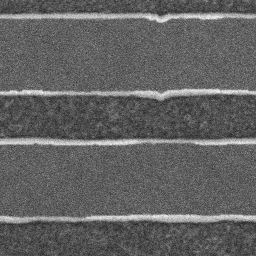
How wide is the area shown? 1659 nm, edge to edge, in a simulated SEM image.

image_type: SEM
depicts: one or a few lines or trenches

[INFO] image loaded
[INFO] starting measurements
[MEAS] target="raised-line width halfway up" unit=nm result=506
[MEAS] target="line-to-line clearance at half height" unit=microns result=0.303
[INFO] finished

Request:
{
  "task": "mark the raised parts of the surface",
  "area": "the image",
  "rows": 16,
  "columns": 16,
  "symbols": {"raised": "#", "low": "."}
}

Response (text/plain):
................
################
################
################
################
################
................
................
................
################
################
################
################
################
................
................